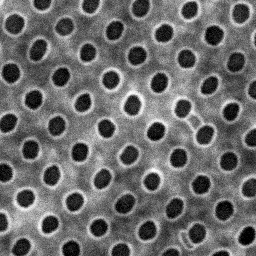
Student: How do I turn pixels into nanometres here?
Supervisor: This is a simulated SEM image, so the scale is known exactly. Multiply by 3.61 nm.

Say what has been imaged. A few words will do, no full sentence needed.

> a regular array of holes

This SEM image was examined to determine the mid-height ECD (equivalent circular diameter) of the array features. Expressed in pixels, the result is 19.3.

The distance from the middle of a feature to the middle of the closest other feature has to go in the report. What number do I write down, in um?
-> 0.124